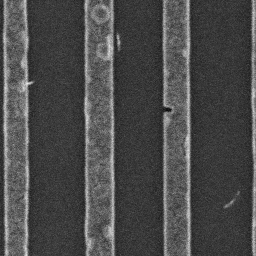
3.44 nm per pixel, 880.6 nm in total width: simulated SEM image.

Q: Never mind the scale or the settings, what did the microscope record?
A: one or a few lines or trenches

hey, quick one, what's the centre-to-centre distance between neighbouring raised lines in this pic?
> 276 nanometres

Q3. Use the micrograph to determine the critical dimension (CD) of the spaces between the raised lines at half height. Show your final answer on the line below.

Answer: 203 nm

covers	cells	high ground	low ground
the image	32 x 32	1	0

01100000000111000000111000000000
01100000000111000000111000000000
01100000000111000000011100000000
01100000000111000000011100000000
01100000000111000000011100000000
01100000000111000000011100000000
01100000000111000000011100000000
01100000000111000000011000000000
01100000000111000000011000000000
01100000000111000000011000000000
01100000000111000000011100000000
01100000000111000000011000000000
01100000000111000000011100000000
01100000000111000000011100000000
01100000000111000000011100000000
01100000000111000000011100000000
01100000000111000000011100000000
01100000000111000000011100000000
01100000000111000000011100000000
01100000000111000000011100000000
01110000000111000000011100000000
01110000000111000000011100000000
01110000000111000000011100000000
01110000000111000000011100000000
01100000000111000000011100000000
01100000000111000000011100000000
01100000000111000000011100000000
01100000000111000000011100000000
01100000000111000000011100000000
01100000000111000000011100000000
01100000000111000000011100000000
01100000000111000000011100000000